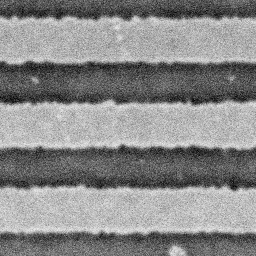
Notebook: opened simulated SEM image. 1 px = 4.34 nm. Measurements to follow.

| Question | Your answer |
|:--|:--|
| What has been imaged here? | lines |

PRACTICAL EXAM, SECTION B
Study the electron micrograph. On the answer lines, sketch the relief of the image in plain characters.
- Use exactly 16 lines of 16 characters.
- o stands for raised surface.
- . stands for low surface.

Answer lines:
................
oooooooooooooooo
oooooooooooooooo
oooooooooooooooo
................
................
.ooo..o.o.oo.ooo
oooooooooooooooo
oooooooooooooooo
................
................
................
oooooooooooooooo
oooooooooooooooo
.o...oooo.....oo
................